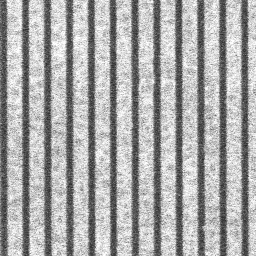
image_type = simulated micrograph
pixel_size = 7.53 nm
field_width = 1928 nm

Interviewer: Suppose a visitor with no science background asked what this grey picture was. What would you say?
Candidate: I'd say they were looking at parallel lines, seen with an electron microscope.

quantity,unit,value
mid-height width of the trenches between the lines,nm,46.1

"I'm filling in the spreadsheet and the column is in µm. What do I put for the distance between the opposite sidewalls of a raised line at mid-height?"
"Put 0.118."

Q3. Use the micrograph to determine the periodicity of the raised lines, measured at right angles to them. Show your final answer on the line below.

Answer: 165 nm